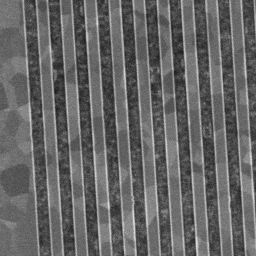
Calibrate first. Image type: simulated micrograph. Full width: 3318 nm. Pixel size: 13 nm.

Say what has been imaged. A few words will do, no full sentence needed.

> parallel lines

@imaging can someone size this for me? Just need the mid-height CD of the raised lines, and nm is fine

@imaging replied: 149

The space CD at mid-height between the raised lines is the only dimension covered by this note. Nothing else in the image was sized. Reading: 162 nm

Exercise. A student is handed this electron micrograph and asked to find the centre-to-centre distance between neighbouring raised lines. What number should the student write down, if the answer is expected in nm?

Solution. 313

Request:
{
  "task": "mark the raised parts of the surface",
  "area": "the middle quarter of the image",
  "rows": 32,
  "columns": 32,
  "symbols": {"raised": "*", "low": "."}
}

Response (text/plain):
***...***...***...***...***...**
***...***...***...***....**....*
***...***...***...***....**....*
***...***...***...***....**....*
***....**....**....**....**....*
***....**....**....**....**....*
***....**....**....**....***...*
.**....**....**....**....***...*
.**....**....**....**....***...*
.***...***...***...***...***...*
.***...***...***...***...***...*
.***...***...***...***...***...*
.***...***...***...***...***...*
.***...***...***...***...***...*
.***...***...***...***...***...*
.***...***...***...***...***...*
.***...***...***...***...***...*
.***...***...***...***....**....
.***...***...***...***....**....
.***...***...***...***....**....
..**....**....**....**....**....
.***....**....**....**....**....
.***....**....**....***...***...
..**....**....**....***...***...
..**....**....**....**....***...
..***...***...***...***...***...
..***...***...***...***...***...
..**....***...***...***...***...
..***...***...***...***...***...
..***...***...***...***...***...
..***...***...***...***...***...
..***...***...***...***...***...